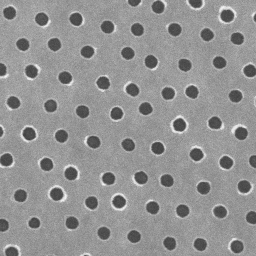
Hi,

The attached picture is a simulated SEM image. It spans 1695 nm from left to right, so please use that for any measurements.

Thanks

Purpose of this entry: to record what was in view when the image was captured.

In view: a regular array of holes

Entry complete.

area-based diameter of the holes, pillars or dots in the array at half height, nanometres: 90.5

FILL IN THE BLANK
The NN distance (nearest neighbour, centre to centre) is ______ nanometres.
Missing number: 197